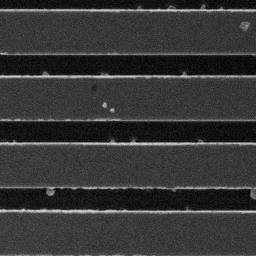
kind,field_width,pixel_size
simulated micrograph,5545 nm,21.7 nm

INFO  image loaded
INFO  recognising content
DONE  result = lines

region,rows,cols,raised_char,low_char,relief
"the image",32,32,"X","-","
--------------------------------
XXXXXXXXXXXXXXXXXXXXXXXXXXXXXXXX
XXXXXXXXXXXXXXXXXXXXXXXXXXXXXXXX
XXXXXXXXXXXXXXXXXXXXXXXXXXXXXXXX
XXXXXXXXXXXXXXXXXXXXXXXXXXXXXXXX
XXXXXXXXXXXXXXXXXXXXXXXXXXXXXXXX
XXXXXXXXXXXXXXXXXXXXXXXXXXXXXXXX
--------------------------------
--------------------------------
--------------------------------
XXXXXXXXXXXXXXXXXXXXXXXXXXXXXXXX
XXXXXXXXXXXXXXXXXXXXXXXXXXXXXXXX
XXXXXXXXXXXXXXXXXXXXXXXXXXXXXXXX
XXXXXXXXXXXXXXXXXXXXXXXXXXXXXXXX
XXXXXXXXXXXXXXXXXXXXXXXXXXXXXXXX
--------------------------------
--------------------------------
--------------------------------
XXXXXXXXXXXXXXXXXXXXXXXXXXXXXXXX
XXXXXXXXXXXXXXXXXXXXXXXXXXXXXXXX
XXXXXXXXXXXXXXXXXXXXXXXXXXXXXXXX
XXXXXXXXXXXXXXXXXXXXXXXXXXXXXXXX
XXXXXXXXXXXXXXXXXXXXXXXXXXXXXXXX
------X--XXXXXXXXXXXXXXXXXXXXXXX
--------------------------------
--------------------------------
XXXXXXXXXXXXXXXXXXXXXXXXXXXXXXXX
XXXXXXXXXXXXXXXXXXXXXXXXXXXXXXXX
XXXXXXXXXXXXXXXXXXXXXXXXXXXXXXXX
XXXXXXXXXXXXXXXXXXXXXXXXXXXXXXXX
XXXXXXXXXXXXXXXXXXXXXXXXXXXXXXXX
XXXXXXXXXXXXXXXXXXXXXXXXXXXXXXXX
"